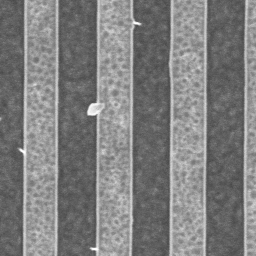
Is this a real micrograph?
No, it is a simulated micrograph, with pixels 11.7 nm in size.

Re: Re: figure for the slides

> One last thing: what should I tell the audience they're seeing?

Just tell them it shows one or a few lines or trenches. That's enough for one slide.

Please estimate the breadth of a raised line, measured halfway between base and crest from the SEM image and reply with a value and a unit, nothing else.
406 nanometres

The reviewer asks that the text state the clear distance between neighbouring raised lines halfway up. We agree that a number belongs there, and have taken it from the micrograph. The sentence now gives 463 nm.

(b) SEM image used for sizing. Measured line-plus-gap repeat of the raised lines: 858 nm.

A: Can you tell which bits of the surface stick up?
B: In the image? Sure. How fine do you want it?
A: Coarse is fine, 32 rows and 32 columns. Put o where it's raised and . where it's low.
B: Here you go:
...oooo.....oooo.....ooooo.....o
...oooo.....ooooo....ooooo.....o
...oooo.....ooooo....ooooo.....o
...oooo.....ooooo....ooooo.....o
...oooo.....oooo.....ooooo.....o
...oooo.....ooooo....ooooo.....o
...oooo.....oooo.....ooooo.....o
...oooo.....oooo.....ooooo.....o
...oooo.....oooo.....ooooo.....o
...oooo.....oooo.....ooooo.....o
...oooo.....oooo.....ooooo.....o
...oooo.....oooo.....ooooo.....o
...oooo.....oooo.....ooooo.....o
...oooo....ooooo.....ooooo.....o
...oooo.....oooo.....ooooo.....o
...oooo.....oooo.....ooooo.....o
...oooo.....oooo.....ooooo.....o
...oooo.....oooo.....ooooo.....o
...oooo.....oooo.....ooooo.....o
...oooo.....oooo.....ooooo.....o
...oooo.....oooo.....ooooo.....o
...oooo.....oooo.....ooooo.....o
...oooo.....oooo.....ooooo.....o
...oooo.....oooo.....ooooo.....o
...oooo.....oooo.....oooo......o
...oooo.....oooo.....ooooo.....o
...oooo.....oooo.....ooooo.....o
...oooo.....oooo.....ooooo.....o
...oooo.....oooo.....ooooo.....o
...oooo.....oooo.....ooooo.....o
...oooo.....oooo.....ooooo.....o
...oooo.....oooo.....ooooo.....o